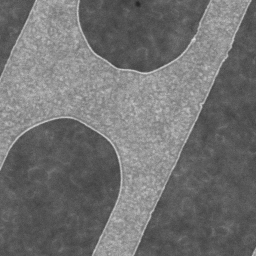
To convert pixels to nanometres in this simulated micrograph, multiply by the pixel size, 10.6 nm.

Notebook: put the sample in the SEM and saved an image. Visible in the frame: one or a few lines or trenches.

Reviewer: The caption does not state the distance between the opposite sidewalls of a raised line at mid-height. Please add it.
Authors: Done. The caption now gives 417 nm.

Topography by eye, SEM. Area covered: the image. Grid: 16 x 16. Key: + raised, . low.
..+++........++.
..+++.......+++.
.++++.......+++.
.+++++.....+++..
++++++++++++++..
+++++++++++++...
+++++++++++++...
+++..+++++++....
+.....++++++....
+......++++.....
........+++.....
........++......
.......+++......
.......++.......
......+++.......
......+++.......